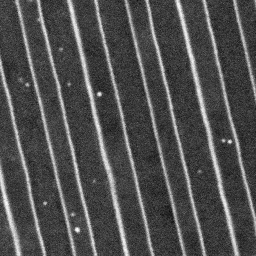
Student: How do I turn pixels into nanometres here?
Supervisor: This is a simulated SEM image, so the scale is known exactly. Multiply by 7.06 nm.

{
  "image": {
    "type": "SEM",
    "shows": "lines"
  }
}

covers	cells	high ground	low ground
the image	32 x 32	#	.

..###....###....###...####...###
..###....###....###....###....##
...##....####...###....###....##
...###...####...###....###....##
...###....###....##....####...##
...###....###....###...####...##
...###....###....###....###....#
....###...####...###....###....#
....###....###....##....###....#
....###....###....###...####...#
#...###....###....###....###....
#....###...####...###....###....
#....###...####...###....###....
#....###....###....##....####...
##...###....###....###....###...
##...###....####...###....###...
##....###...####...###....###...
##....###....###....##....####..
###...###....###....###...####..
###...###....###....###....###..
###....###...####...###....###..
###....###....###....##....###..
####...###....###....###...####.
####...###....###....###...####.
.###....##....####...###....###.
.###....###...####...###....###.
.###....###....###....##....####
.####...###....###....###....###
..###...###....###....###....###
..###....##....####...###....###
..###....###...####....##....###
..####...###....###....###....##